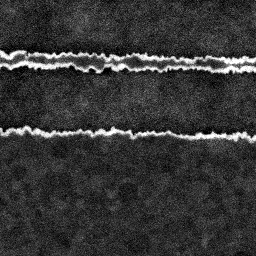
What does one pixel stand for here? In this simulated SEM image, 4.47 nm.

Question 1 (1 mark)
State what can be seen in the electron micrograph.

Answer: one or a few lines or trenches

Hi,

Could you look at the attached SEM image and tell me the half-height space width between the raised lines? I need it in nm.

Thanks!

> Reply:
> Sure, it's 286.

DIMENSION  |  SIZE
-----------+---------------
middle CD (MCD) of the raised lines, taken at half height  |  55.8 nm